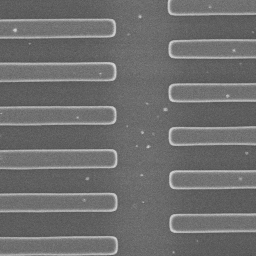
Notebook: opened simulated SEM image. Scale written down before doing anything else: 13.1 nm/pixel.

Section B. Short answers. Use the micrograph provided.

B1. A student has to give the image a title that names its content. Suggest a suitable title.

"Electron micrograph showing groups of lines, slits or small figures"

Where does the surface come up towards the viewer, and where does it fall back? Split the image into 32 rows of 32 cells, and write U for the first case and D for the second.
DDDDDDDDDDDDDDDDDDDDDUUUUUUUUUUU
DDDDDDDDDDDDDDDDDDDDDUUUUUUUUUUU
DDDUUUUUUUUUUUDDDDDDDDDDDDDDDDDD
UUUUUUUUUUUUUUDDDDDDDDDDDDDDDDDD
UUUUUUUUUUUUUUDDDDDDDDDDDDDDDDDD
DDDDDDDDDDDDDDDDDDDDDUUUUUUUUUUU
DDDDDDDDDDDDDDDDDDDDDUUUUUUUUUUU
DDDDDDDDDDDDDDDDDDDDDDDDDDDDDDDD
UUUUUUUUUUUUUUDDDDDDDDDDDDDDDDDD
UUUUUUUUUUUUUUDDDDDDDDDDDDDDDDDD
DDDDDDDDDDDDDDDDDDDDDDDDDDDDDDDD
DDDDDDDDDDDDDDDDDDDDDUUUUUUUUUUU
DDDDDDDDDDDDDDDDDDDDDUUUUUUUUUUU
UUUUUUUUUUUUUUDDDDDDDDDDDDDDDDDD
UUUUUUUUUUUUUUDDDDDDDDDDDDDDDDDD
UUUUUDDDDDDDDDDDDDDDDDDDDDDDDDDD
DDDDDDDDDDDDDDDDDDDDDUUUUUUUUUUU
DDDDDDDDDDDDDDDDDDDDDUUUUUUUUUUU
DDDDDDDDDDDDDDDDDDDDDDDDDDDDDDDD
UUUUUUUUUUUUUUDDDDDDDDDDDDDDDDDD
UUUUUUUUUUUUUUDDDDDDDDDDDDDDDDDD
DDDDDDDDDDDDDDDDDDDDDDUUUUUUUUUU
DDDDDDDDDDDDDDDDDDDDDUUUUUUUUUUU
DDDDDDDDDDDDDDDDDDDDDDUUUUUUUDDD
UUUUUUUUUUUUUUDDDDDDDDDDDDDDDDDD
UUUUUUUUUUUUUUUDDDDDDDDDDDDDDDDD
DDDDDDDDDDDDDDDDDDDDDDDDDDDDDDDD
DDDDDDDDDDDDDDDDDDDDDUUUUUUUUUUU
DDDDDDDDDDDDDDDDDDDDDUUUUUUUUUUU
DDDDDDDDDDDDDDDDDDDDDDDDDDDDDDDD
UUUUUUUUUUUUUUUDDDDDDDDDDDDDDDDD
UUUUUUUUUUUUUUDDDDDDDDDDDDDDDDDD